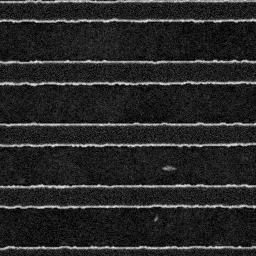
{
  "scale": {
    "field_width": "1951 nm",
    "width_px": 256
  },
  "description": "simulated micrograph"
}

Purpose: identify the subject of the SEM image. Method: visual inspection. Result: lines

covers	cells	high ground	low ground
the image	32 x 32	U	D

UUUUUUUUUUUUUUUUUUUUUUUUUUUUUUUU
UUUUUUUUUUUUUUUUUUUUUUUUUUUUUUUU
UUUUUUUUUUUUUUUUUUUUUUUUUUUUUUUU
DDDDDDDDDDDDDDDDDDDDDDDDDDDDDDDD
DDDDDDDDDDDDDDDDDDDDDDDDDDDDDDDD
DDDDDDDDDDDDDDDDDDDDDDDDDDDDDDDD
DDDDDDDDDDDDDDDDDDDDDDDDDDDDDDDD
DDDDDDDDDDDDDDDDDDDDDDDDDDDDDDDD
UUUUUUUUUUUUUUUUUUUUUUUUUUUUUUUU
UUUUUUUUUUUUUUUUUUUUUUUUUUUUUUUU
UUUUUUDUUUUUDUDUUUUDUUUDDDDDDDDD
DDDDDDDDDDDDDDDDDDDDDDDDDDDDDDDD
DDDDDDDDDDDDDDDDDDDDDDDDDDDDDDDD
DDDDDDDDDDDDDDDDDDDDDDDDDDDDDDDD
DDDDDDDDDDDDDDDDDDDDDDDDDDDDDDDD
DDDDUDDDDDDDDUDDUUDDUDDDUUDUUUUU
UUUUUUUUUUUUUUUUUUUUUUUUUUUUUUUU
UUUUUUUUUUUUUUUUUUUUUUUUUUUUUUUU
DDDDDDDDDDDDDDDDDDDDDDDDDDDDDDDD
DDDDDDDDDDDDDDDDDDDDDDDDDDDDDDDD
DDDDDDDDDDDDDDDDDDDDDDDDDDDDDDDD
DDDDDDDDDDDDDDDDDDDDDDDDDDDDDDDD
DDDDDDDDDDDDDDDDDDDDDDDDDDDDDDDD
UUUUUUUUUUUUUUUUUUUUUUUUUUUUUUUU
UUUUUUUUUUUUUUUUUUUUUUUUUUUUUUUU
UUUUUUUUUUUUUUUUUUUUUUUUUUUUUUUU
DDDDDDDDDDDDDDDDDDDDDDDDDDDDDDDD
DDDDDDDDDDDDDDDDDDDDDDDDDDDDDDDD
DDDDDDDDDDDDDDDDDDDDDDDDDDDDDDDD
DDDDDDDDDDDDDDDDDDDDDDDDDDDDDDDD
DDDDDDDDDDDDDDDDDDDDDDDDDDDDDDDD
UUUUUUUUUUUUUUUUUUUUUUUUUUUUUUUU